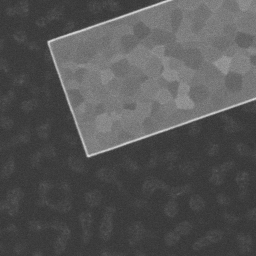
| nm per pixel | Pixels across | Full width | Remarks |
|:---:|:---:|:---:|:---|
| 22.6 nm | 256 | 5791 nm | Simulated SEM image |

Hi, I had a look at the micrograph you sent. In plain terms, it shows one or a few lines or trenches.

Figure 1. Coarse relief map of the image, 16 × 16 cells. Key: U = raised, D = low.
DDDDDDDDDUUUUUUU
DDDDDDUUUUUUUUUU
DDDUUUUUUUUUUUUU
DDDUUUUUUUUUUUUU
DDDDUUUUUUUUUUUU
DDDDUUUUUUUUUUUU
DDDDUUUUUUUUUUUD
DDDDDUUUUUUUDDDD
DDDDDUUUUDDDDDDD
DDDDDDDDDDDDDDDD
DDDDDDDDDDDDDDDD
DDDDDDDDDDDDDDDD
DDDDDDDDDDDDDDDD
DDDDDDDDDDDDDDDD
DDDDDDDDDDDDDDDD
DDDDDDDDDDDDDDDD